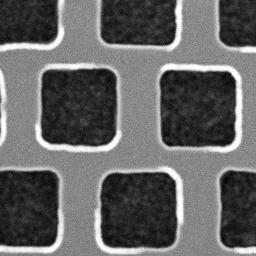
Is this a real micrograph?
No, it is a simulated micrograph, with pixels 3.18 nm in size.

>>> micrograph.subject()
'holes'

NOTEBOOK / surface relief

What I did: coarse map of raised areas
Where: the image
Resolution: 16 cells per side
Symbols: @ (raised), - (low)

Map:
----@@-----@@@--
----@@-----@@@--
---@@@@----@@@--
@@@@@@@@@@@@@@@@
@@@----@@@----@@
@@@----@@@-----@
@@@----@@@-----@
@@@----@@@-----@
@@@----@@@-----@
@@@@@@@@@@@@@@@@
@@@@@@@@@@@@@@@@
----@@-----@@@--
----@@-----@@@--
----@@-----@@@--
----@@-----@@@--
@@@@@@@---@@@@@@